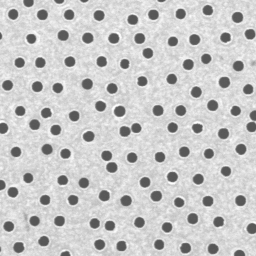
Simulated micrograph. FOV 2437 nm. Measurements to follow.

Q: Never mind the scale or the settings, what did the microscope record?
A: a regular array of holes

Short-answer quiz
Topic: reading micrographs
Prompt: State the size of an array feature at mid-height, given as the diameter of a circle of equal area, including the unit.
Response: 0.106 microns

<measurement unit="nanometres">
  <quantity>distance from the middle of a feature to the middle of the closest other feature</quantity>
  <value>209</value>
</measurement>